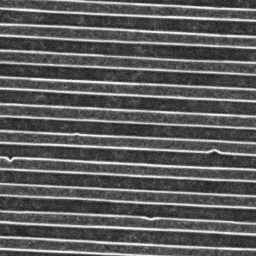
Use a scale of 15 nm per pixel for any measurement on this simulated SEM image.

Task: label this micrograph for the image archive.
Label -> parallel lines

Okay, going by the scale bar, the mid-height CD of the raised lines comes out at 188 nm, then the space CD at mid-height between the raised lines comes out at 216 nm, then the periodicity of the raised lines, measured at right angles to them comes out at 26.6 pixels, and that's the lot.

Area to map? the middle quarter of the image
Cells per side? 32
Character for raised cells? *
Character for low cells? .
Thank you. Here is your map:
...*****************************
........................********
................................
................................
*******.........................
****************************....
********************************
.........***********************
..............................**
................................
................................
*************...................
********************************
********************************
...............*****************
................................
................................
................................
*******************.............
********************************
.....***************************
.........................*******
................................
................................
*****...........................
*************************.......
********************************
..........**********************
...........................***.*
................................
................................
**************..................